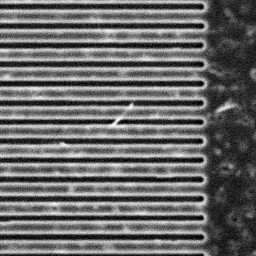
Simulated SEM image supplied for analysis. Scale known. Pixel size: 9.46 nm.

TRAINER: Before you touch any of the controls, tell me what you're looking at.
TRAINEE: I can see parallel lines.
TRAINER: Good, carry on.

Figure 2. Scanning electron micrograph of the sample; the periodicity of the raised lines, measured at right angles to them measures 182 nanometers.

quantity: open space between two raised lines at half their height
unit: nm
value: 63.9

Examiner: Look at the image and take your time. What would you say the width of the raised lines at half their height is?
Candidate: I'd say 121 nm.